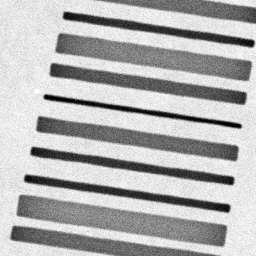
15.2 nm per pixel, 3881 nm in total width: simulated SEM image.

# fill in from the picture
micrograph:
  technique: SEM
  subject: groups of lines, slits or small figures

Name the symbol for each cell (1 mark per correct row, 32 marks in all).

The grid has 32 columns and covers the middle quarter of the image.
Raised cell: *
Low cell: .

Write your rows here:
..****************..............
..........****************......
...............*****************
.......................*********
*****.......................****
************....................
******************..............
*************************.......
..*****************************.
.........***********************
*****..........*****************
************...........*********
******************..........****
*************************.......
....***************************.
............********************
.................***************
.........................*******
***............................*
*********.......................
***************.................
***********************.........
....*************************...
............********************
*.................**************
********................********
**************..................
**********************..........
***************************.....
....****************************
...........*********************
**................**************